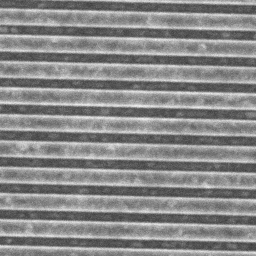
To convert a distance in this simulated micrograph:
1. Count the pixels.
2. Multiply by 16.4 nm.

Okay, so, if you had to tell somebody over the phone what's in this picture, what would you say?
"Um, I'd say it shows parallel lines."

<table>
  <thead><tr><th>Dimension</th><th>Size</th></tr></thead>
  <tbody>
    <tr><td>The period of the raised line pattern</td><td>0.432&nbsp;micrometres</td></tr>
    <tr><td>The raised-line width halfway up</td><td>248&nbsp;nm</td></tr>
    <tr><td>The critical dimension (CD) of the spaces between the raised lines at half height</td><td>184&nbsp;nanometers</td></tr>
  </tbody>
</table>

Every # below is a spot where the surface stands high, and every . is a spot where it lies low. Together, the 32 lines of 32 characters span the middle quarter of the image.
#############################...
################################
################################
################################
................................
................................
#####...........................
################################
################################
################################
..............##################
................................
................................
############....................
################################
################################
################################
...............................#
................................
................................
#############################...
################################
################################
.......#########################
................................
................................
#####...........................
################################
################################
################################
........................########
................................